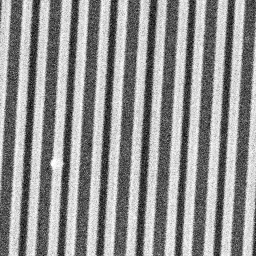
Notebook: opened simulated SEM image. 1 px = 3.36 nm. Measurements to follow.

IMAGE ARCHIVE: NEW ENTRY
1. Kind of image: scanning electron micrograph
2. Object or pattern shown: parallel lines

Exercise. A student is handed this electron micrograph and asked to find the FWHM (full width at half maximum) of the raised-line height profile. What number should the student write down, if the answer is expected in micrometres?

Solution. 0.0272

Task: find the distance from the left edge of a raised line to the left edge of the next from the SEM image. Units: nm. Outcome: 64.9